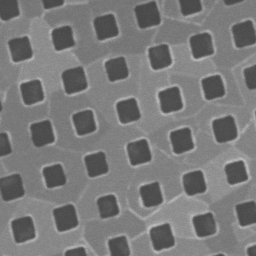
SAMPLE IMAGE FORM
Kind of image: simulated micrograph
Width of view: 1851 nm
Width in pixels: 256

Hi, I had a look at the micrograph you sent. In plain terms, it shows a regular array of holes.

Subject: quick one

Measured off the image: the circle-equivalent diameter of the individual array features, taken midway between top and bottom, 187 nm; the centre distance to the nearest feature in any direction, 43.3 px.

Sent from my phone